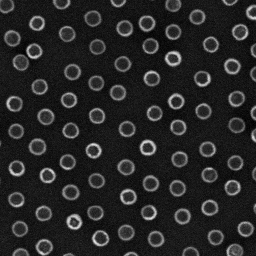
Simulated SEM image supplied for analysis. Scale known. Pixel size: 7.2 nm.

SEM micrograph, a regular array of raised bodies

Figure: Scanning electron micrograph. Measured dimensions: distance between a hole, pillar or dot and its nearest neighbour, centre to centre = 0.196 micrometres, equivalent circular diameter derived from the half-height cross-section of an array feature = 0.107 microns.